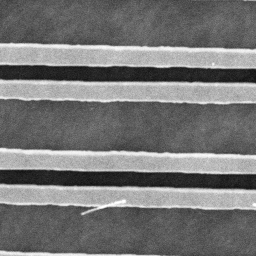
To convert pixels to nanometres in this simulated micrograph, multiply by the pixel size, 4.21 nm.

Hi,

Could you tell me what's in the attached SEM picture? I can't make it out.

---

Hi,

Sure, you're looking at lines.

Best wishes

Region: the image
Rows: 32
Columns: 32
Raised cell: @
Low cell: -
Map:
--------------------------------
--------------------------------
--------------------------------
--------------------------------
--------------------------------
--------------------------------
@@@@@@@@@@@@@@@@@@@@@@@@@@@@@@@@
@@@@@@@@@@@@@@@@@@@@@@@@@@@@@@@@
--------------------------------
--------------------------------
@@@@@@@@@@@@@@@@@@@@@@@@@@@@@@@@
@@@@@@@@@@@@@@@@@@@@@@@@@@@@@@@@
----------@@@@@@@@@@@@@@@@@@@@@@
--------------------------------
--------------------------------
--------------------------------
--------------------------------
--------------------------------
--------------------------------
@@@@@@@@@@@@@@@@@@@@@@@@@@@@@@@@
@@@@@@@@@@@@@@@@@@@@@@@@@@@@@@@@
-----------------------@@@@@@@@@
--------------------------------
@@@@@@@@@@@@@@@@@@@@@-----------
@@@@@@@@@@@@@@@@@@@@@@@@@@@@@@@@
--@@@@@@@@@@@@@@@@@@@@@@@@@@@@@@
--------------------------------
--------------------------------
--------------------------------
--------------------------------
--------------------------------
@-------------------------------